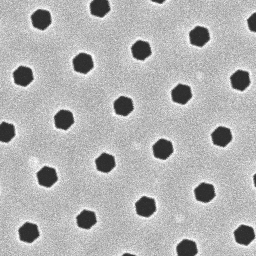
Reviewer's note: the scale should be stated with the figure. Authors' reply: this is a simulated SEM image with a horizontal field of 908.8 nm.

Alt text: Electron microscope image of a regular array of holes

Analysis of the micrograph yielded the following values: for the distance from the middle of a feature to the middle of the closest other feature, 209 nm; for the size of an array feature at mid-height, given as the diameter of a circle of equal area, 75.1 nm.